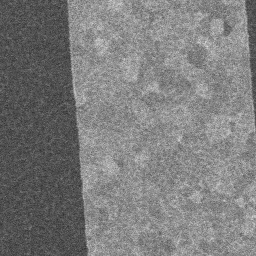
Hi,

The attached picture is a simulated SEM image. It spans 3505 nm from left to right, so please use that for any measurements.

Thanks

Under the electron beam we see one or a few lines or trenches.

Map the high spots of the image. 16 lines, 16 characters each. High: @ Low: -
----@@@@@@@@@@@-
----@@@@@@@@@@@-
----@@@@@@@@@@@-
----@@@@@@@@@@@@
-----@@@@@@@@@@@
-----@@@@@@@@@@@
-----@@@@@@@@@@@
-----@@@@@@@@@@@
-----@@@@@@@@@@@
-----@@@@@@@@@@@
-----@@@@@@@@@@@
-----@@@@@@@@@@@
-----@@@@@@@@@@@
-----@@@@@@@@@@@
-----@@@@@@@@@@@
-----@@@@@@@@@@@